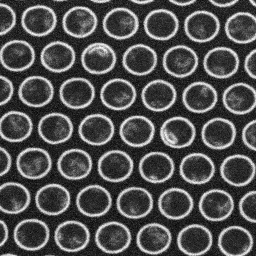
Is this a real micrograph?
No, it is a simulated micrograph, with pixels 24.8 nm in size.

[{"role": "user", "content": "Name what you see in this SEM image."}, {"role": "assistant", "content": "a regular array of raised bodies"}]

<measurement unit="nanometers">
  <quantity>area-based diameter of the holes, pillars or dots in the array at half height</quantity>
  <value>772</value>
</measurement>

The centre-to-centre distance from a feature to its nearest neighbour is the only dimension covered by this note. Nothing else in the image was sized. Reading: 1.01 µm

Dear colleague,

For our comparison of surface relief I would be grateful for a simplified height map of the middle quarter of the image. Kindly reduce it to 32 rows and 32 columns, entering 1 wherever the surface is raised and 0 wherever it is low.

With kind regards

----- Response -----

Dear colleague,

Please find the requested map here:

11000111111100011111110001111111
00000011111000001111110000111111
00000000000000000011000000011110
00000000000000000000000000000000
01111100000011110000001110000000
11111110001111111000011111100000
11111110001111111000111111100001
11111110011111111100111111110011
11111110001111111000111111110011
11111110001111111000111111100011
00111000000111110000011111000001
00000000000000000000000000000000
00000000000000000000000000000000
10000011111000000111000000000000
10000111111100011111100000111110
11001111111100011111110001111111
11001111111100111111110001111111
11001111111100111111110001111111
10000111111000011111110001111111
00000011110000001111100001111111
00000000000000000000000000011100
00000000000000000000000000000000
11111100000111100000001110000000
11111100001111110000111111000001
11111110011111111001111111100011
11111110011111111001111111100111
11111100011111111001111111100111
11111100011111110000111111100011
01100000001111100000111111000011
00000000000000000000000000000000
00000000000000000000000000000000
00000111110000001111000000011000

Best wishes